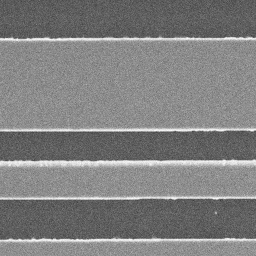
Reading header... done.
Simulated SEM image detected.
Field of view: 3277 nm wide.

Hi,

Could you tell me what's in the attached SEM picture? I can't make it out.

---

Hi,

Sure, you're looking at lines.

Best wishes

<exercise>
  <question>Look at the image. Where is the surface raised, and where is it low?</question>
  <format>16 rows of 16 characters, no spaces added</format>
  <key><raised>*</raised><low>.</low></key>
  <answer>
................
................
****************
****************
****************
****************
****************
****************
................
................
****************
****************
................
................
................
****************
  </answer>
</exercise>